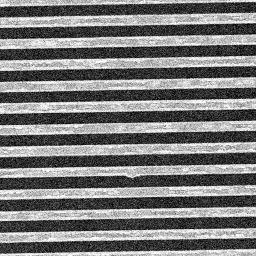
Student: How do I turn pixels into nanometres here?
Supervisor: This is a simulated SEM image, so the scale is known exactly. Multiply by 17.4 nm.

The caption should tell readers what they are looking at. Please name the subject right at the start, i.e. parallel lines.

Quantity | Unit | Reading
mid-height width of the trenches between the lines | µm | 0.211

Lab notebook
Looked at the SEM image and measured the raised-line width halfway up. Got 0.161 µm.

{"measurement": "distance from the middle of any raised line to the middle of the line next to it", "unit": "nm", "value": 374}